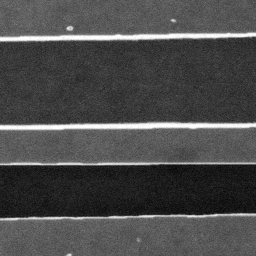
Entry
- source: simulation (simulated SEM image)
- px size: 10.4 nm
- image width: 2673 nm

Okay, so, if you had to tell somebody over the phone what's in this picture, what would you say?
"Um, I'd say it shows lines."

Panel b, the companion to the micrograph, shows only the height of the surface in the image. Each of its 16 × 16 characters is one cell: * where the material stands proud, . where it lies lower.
****************
****************
................
................
................
................
................
................
****************
****************
................
................
................
.........*******
****************
****************